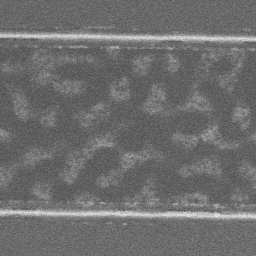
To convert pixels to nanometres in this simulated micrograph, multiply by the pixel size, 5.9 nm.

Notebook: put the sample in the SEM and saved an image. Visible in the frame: one or a few lines or trenches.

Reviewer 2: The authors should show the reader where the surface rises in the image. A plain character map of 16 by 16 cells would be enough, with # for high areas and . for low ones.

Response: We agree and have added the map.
................
................
################
################
################
################
################
################
################
################
################
################
################
............##.#
................
................